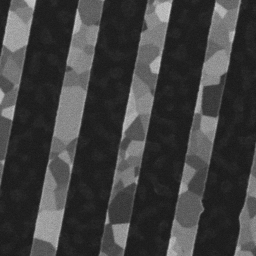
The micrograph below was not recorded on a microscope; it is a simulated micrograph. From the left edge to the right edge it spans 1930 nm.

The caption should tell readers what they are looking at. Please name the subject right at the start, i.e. one or a few lines or trenches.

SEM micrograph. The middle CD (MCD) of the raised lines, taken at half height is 179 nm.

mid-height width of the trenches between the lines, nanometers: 326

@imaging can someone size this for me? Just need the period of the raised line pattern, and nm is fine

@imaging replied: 504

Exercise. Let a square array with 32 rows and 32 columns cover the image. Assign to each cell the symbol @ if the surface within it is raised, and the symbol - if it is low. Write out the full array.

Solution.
-@@@------@@@-----@@@------@@@--
-@@@------@@@-----@@@------@@@--
-@@@-----@@@@-----@@@------@@@--
-@@@-----@@@------@@@-----@@@---
-@@@-----@@@------@@@-----@@@---
@@@------@@@-----@@@------@@@---
@@@------@@@-----@@@------@@@---
@@@-----@@@@-----@@@------@@@---
@@@-----@@@------@@@-----@@@----
@@@-----@@@------@@@-----@@@----
@@------@@@-----@@@------@@@----
@@------@@@-----@@@------@@@----
@@------@@@-----@@@------@@@----
@@-----@@@------@@@-----@@@-----
@@-----@@@------@@@-----@@@-----
@------@@@-----@@@@-----@@@-----
@------@@@-----@@@------@@@-----
@------@@@@----@@@------@@@---@-
@-----@@@------@@@------@@@-----
@-----@@@------@@@-----@@@------
------@@@------@@@-----@@@------
------@@@-----@@@------@@@-----@
------@@@-----@@@-----@@@@-----@
-----@@@@-----@@@--@---@@@-----@
-----@@@@-----@@@-----@@@------@
-----@@@------@@@-----@@@------@
-----@@@-----@@@------@@@-----@@
-----@@@-----@@@------@@@-----@@
----@@@@-----@@@------@@@-----@@
----@@@------@@@-----@@@------@@
----@@@------@@@-----@@@------@@
----@@@------@@------@@@-----@@@